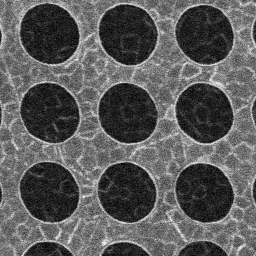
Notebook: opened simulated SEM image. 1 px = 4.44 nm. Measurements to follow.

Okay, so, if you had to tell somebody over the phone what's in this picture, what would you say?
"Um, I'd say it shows a regular array of holes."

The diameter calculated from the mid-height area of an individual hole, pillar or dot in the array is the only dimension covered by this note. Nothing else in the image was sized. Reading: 269 nm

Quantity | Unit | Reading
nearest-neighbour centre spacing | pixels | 77.5